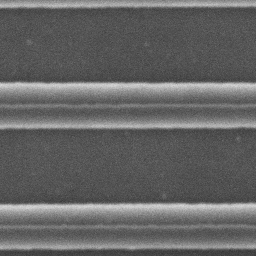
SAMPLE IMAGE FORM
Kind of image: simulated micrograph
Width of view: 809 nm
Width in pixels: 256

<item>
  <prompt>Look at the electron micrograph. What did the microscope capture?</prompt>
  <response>lines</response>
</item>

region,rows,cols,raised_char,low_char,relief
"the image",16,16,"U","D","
DDDDDDDDDDDDDDDD
DDDDDDDDDDDDDDDD
DDDDDDDDDDDDDDDD
DDDDDDDDDDDDDDDD
DDDDDDDDDDDDDDDD
UUUUUUUUUUUUUUUU
UUUUUUUUUUUUUUUU
UUUUUUUUUUUUUUUU
DDDDDDDDDDDDDDDD
DDDDDDDDDDDDDDDD
DDDDDDDDDDDDDDDD
DDDDDDDDDDDDDDDD
DDDDDDDDDDDDDDDD
UUUUUUUUUUUUUUUU
UUUUUUUUUUUUUUUU
DUDUUDDDDDDDDDDD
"